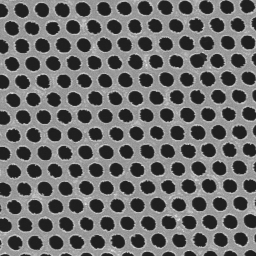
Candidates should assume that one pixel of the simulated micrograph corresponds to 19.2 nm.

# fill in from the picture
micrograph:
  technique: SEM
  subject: a regular array of holes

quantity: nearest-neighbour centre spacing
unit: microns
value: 0.386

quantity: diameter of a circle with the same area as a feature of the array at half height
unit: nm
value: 271